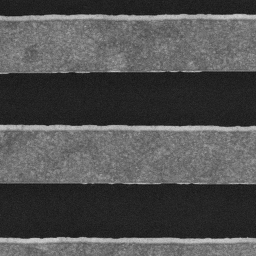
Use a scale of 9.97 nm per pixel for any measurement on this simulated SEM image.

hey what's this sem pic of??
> lines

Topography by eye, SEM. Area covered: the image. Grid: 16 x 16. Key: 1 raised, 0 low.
0000000000000000
1111111111111111
1111111111111111
1111111111111111
1111110000000000
0000000000000000
0000000000000000
0000000000000000
1111111111111111
1111111111111111
1111111111111111
0000000000000000
0000000000000000
0000000000000000
0000000000000000
1111111111111111